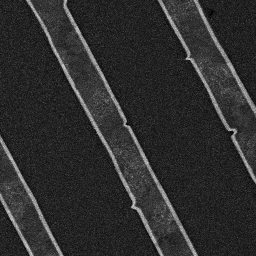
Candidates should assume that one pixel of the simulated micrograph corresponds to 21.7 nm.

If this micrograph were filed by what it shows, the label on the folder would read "one or a few lines or trenches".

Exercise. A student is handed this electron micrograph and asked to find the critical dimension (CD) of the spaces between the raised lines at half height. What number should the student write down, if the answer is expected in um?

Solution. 1.91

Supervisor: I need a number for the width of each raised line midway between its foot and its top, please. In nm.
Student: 634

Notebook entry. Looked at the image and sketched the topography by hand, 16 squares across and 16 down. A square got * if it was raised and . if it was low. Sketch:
..**......**....
...**......**...
...**......**...
....**......**..
....**......***.
.....**......**.
.....**......***
......**......**
......**.......*
.......**......*
*......**.......
**......**......
**......**......
.**......**.....
.**......**.....
..**......**....